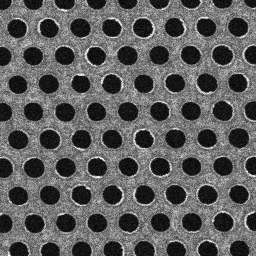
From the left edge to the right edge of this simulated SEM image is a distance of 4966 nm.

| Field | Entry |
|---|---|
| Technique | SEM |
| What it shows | a regular array of holes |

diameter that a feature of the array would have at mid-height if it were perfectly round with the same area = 0.378 micrometres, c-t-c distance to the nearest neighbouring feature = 608 nm